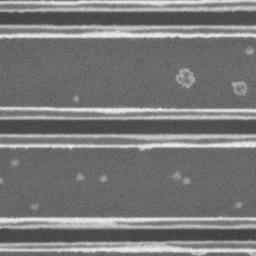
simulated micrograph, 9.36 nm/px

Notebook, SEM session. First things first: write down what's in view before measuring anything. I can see lines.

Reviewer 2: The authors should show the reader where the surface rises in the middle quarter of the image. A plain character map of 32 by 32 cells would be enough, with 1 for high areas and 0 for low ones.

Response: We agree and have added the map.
00000000000000000000000000000000
00000000000000000000000000000000
00000000000000000000000000000000
00000000000000000000000000000000
00000000000000000000000000000000
00000000000000000000000000000000
00000000000000000000000000000000
00000000000000000000000000000000
00000000000000000000000000000000
00000000000000000000000000000000
00000000000000000000000000000000
11111111111111111111111111111111
11111111111111111111111111111111
11111111111111111111111111111111
00000000000000000000000000000000
00000000000000000000000000000000
00000000000000000000000000000000
00000000000000000000000000000000
11111111111111111111111111111111
11111111111111111111111111111111
10111111111111111111100000000000
00000000000000000000000000000000
00000000000000000000000000000000
00000000000000000000000000000000
00000000000000000000000000000000
00000000000000000000000000000000
00000000000000000000000000000000
00000000000000000000000000000000
00000000000000000000000000000000
00000000000000000000000000000000
00000000000000000000000000000000
00000000000000000000000000000000